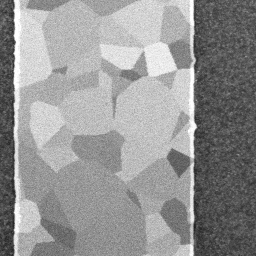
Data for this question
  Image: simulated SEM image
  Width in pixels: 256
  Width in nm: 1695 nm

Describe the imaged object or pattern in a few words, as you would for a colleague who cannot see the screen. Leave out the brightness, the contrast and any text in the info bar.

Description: one or a few lines or trenches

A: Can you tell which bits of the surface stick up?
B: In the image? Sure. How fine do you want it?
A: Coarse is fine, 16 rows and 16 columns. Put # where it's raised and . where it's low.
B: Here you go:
.###########....
.###########....
.###########....
.###########....
.###########....
.###########....
.###########....
.###########....
.###########....
.###########....
.###########....
.###########....
.###########....
.###########....
.###########....
.###########....